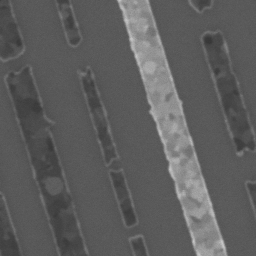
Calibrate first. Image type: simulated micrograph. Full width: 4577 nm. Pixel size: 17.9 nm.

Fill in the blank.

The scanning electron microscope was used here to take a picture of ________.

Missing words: one or a few lines or trenches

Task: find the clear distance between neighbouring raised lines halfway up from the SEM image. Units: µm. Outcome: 0.792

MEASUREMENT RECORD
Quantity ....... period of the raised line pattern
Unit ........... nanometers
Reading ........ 1170